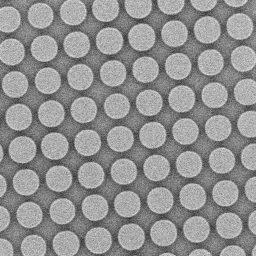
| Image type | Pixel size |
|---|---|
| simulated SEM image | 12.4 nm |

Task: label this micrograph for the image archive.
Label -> an array of small figures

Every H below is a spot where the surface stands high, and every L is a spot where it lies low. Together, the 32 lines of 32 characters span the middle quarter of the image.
LLLHHLLLLLHHHHHLLHHHHHHLLHHHHHHH
LHHHHHHLLHHHHHHLLHHHHHHLLLHHHHHH
LHHHHHHLLHHHHHHLLHHHHHHLLLHHHHHL
LHHHHHHLLHHHHHHLLLHHHHHLLLLHHHLL
LHHHHHHLLLHHHHHLLLLLLLLLLLLLLLLL
LLHHHHLLLLLLLLLLLLLLLLLLLLLLLLLL
LLLLLLLLLLLLLLLLLLLLLLLLLLLHHHHH
LLLLLLLLLLLLLLLLLLLHHHHHLLHHHHHH
LLLLHHLLLLLHHHHHLLHHHHHHLLHHHHHH
LLHHHHHLLLHHHHHHLLHHHHHHLLHHHHHH
LLHHHHHHLLHHHHHHLLHHHHHHLLLHHHHH
LLHHHHHHLLHHHHHHLLLHHHHHLLLLHHHL
LLHHHHHHLLLHHHHHLLLLHHHLLLLLLLLL
LLHHHHHLLLLLHHLLLLLLLLLLLLLLLLLL
LLLLHHLLLLLLLLLLLLLLLLLLLLLLHHHH
LLLLLLLLLLLLLLLLLLLLHHHHLLLLHHHH
LLLLLLLLLLLLHHHHLLLHHHHHHLLHHHHH
LLLLHHHHLLLHHHHHHLLHHHHHHLLHHHHH
LLLHHHHHHLLHHHHHHLLHHHHHHLLLHHHH
HLLHHHHHHLLHHHHHHLLHHHHHHLLLLHHH
HLLHHHHHHLLHHHHHHLLLHHHHLLLLLLLL
HLLHHHHHLLLLLHHLLLLLLLLLLLLLLLLL
LLLLLHHLLLLLLLLLLLLLLLLLLLLLLLHH
LLLLLLLLLLLLLLLLLLLLLHHHHLLLLHHH
LLLLLLLLLLLLLHHHHLLLHHHHHHLLHHHH
LLLLLHHHHLLLHHHHHHLLHHHHHHLLHHHH
HLLLHHHHHHLLHHHHHHLLHHHHHHLLHHHH
HHLLHHHHHHLLHHHHHHLLHHHHHHLLLHHH
HHLLHHHHHHLLHHHHHHLLLHHHHLLLLLLL
HHLLHHHHHLLLLHHHHLLLLLLLLLLLLLLL
HLLLLHHHLLLLLLLLLLLLLLLLLLLLLLHH
LLLLLLLLLLLLLLLLLLLLLLHHHHLLLHHH